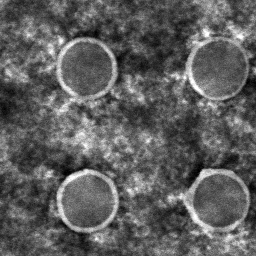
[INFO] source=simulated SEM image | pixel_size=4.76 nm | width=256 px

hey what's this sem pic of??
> raised bodies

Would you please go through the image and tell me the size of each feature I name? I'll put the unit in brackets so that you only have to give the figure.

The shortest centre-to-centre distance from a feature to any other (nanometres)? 622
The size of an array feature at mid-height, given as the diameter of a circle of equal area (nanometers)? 296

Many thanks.